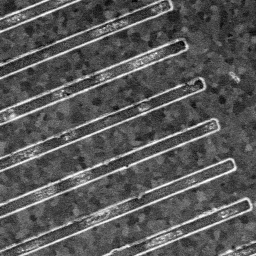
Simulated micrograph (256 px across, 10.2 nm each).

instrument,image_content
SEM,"parallel lines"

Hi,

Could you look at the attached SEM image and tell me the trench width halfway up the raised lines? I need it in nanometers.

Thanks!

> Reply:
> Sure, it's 121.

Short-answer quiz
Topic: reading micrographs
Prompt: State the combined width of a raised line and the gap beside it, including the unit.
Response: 0.439 um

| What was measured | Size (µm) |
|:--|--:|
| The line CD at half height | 0.324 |